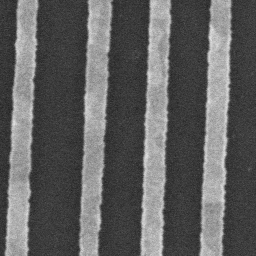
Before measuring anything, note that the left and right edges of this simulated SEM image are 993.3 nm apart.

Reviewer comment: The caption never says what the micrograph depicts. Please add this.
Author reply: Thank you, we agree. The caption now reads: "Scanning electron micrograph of lines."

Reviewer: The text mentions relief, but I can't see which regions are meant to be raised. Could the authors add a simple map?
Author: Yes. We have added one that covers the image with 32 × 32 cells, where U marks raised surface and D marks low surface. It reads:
DDUUUDDDDDDUUUDDDDDUUDDDDDUUUDDD
DDUUUDDDDDDUUUDDDDDUUDDDDDUUUDDD
DDUUDDDDDDDUUUDDDDDUUDDDDDUUUDDD
DDUUDDDDDDDUUUDDDDDUUDDDDDUUUDDD
DDUUDDDDDDDUUUDDDDDUUDDDDDUUUDDD
DDUUDDDDDDDUUUDDDDDUUDDDDDUUUDDD
DDUUDDDDDDDUUDDDDDDUUDDDDDUUUDDD
DDUUDDDDDDDUUDDDDDUUUDDDDDUUUDDD
DDUUDDDDDDDUUDDDDDUUUDDDDDUUUDDD
DDUUDDDDDDDUUDDDDDUUUDDDDDUUUDDD
DDUUDDDDDDDUUDDDDDUUUDDDDDUUUDDD
DDUUDDDDDDDUUDDDDDUUUDDDDDUUUDDD
DDUUDDDDDDDUUDDDDDUUUDDDDDUUDDDD
DDUUDDDDDDDUUDDDDDUUUDDDDDUUDDDD
DDUUDDDDDDDUUDDDDDUUUDDDDDUUDDDD
DDUUDDDDDDDUUDDDDDUUUDDDDDUUDDDD
DDUUDDDDDDDUUDDDDDUUUDDDDDUUDDDD
DDUUDDDDDDDUUDDDDDUUUDDDDDUUDDDD
DDUUDDDDDDDUUDDDDDUUUDDDDDUUDDDD
DUUUDDDDDDUUUDDDDDUUUDDDDDUUDDDD
DUUUDDDDDDUUUDDDDDUUUDDDDUUUDDDD
DUUUDDDDDDUUUDDDDDUUUDDDDUUUDDDD
DUUUDDDDDDUUUDDDDDUUUDDDDUUUDDDD
DUUUDDDDDDUUUDDDDDUUDDDDDUUUDDDD
DUUUDDDDDDUUUDDDDDUUDDDDDUUUDDDD
DUUUDDDDDDUUUDDDDDUUDDDDDUUUDDDD
DUUUDDDDDDUUUDDDDDUUDDDDDUUUDDDD
DUUDDDDDDDUUUDDDDDUUDDDDDUUUDDDD
DUUDDDDDDDUUDDDDDDUUDDDDDUUUDDDD
DUUDDDDDDDUUDDDDDDUUDDDDDUUUDDDD
DUUDDDDDDDUUDDDDDDUUDDDDDUUUDDDD
DUUDDDDDDDUUDDDDDDUUDDDDDUUUDDDD